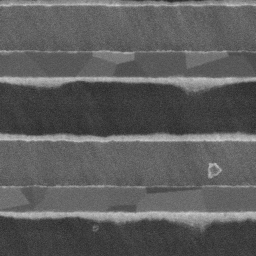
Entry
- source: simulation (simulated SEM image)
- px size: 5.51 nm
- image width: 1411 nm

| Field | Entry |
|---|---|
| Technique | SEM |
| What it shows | lines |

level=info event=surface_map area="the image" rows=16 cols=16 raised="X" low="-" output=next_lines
XXXXXXXXXXXXXXXX
XXXXXXXXXXXXXXXX
XXXXXXXXXXXXXXXX
XXXXXXXXXXXXXXXX
XXXXXXXXXXXXXXXX
----------------
----------------
----------------
----------------
XXXXXXXXXXXXXXXX
XXXXXXXXXXXXXXXX
XXXXXXXXXXXXXXXX
XXXXXXXXXXXXXXXX
----------------
----------------
----------------